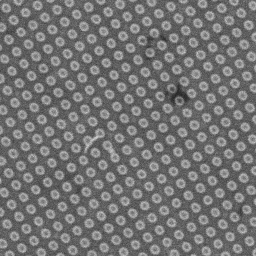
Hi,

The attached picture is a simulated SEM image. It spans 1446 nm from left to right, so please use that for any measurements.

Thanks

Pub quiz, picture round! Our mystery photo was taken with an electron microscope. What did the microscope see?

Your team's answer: a regular array of raised bodies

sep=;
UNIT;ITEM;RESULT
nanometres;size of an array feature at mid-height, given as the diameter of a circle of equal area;49.8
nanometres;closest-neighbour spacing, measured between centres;78.8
